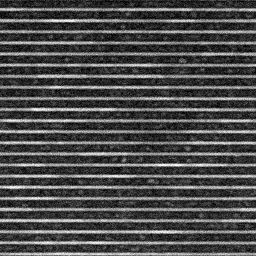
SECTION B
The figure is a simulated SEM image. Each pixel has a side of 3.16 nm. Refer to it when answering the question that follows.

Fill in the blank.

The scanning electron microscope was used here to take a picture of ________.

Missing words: parallel lines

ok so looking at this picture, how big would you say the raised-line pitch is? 35.1 nanometers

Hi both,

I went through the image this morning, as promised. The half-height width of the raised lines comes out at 2.12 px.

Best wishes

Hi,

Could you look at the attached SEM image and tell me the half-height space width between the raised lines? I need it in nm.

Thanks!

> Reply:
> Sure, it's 27.3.